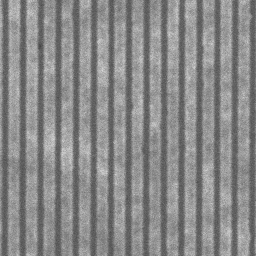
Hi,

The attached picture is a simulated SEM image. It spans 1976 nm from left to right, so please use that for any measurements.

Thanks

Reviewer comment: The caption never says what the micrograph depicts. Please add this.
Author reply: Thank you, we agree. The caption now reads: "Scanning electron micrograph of parallel lines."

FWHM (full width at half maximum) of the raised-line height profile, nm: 69.5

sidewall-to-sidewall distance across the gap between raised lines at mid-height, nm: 68.5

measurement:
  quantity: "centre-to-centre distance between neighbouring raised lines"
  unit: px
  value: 17.7